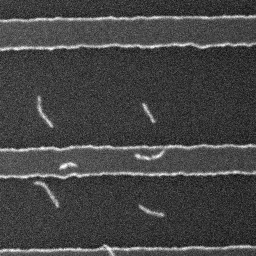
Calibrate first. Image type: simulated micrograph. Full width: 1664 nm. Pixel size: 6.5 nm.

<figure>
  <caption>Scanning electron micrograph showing lines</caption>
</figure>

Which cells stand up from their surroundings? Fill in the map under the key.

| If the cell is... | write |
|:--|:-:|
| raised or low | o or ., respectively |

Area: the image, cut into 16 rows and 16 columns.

................
oooooooooooooooo
oooooooooooooooo
................
................
................
................
................
................
oooooooooooooooo
oooooooooooooooo
................
................
................
................
......o....oo.oo